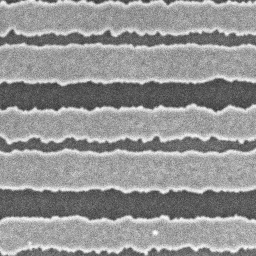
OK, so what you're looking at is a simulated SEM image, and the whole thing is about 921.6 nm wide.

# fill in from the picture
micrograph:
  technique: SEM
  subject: lines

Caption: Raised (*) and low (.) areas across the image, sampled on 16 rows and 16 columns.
****************
****************
****************
****************
****************
................
................
****************
****************
****************
****************
****************
................
................
****************
****************